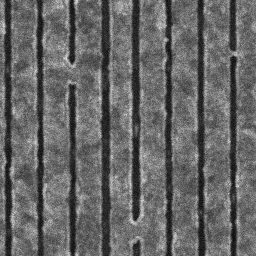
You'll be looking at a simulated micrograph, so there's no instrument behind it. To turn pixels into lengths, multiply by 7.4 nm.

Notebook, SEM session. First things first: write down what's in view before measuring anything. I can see parallel lines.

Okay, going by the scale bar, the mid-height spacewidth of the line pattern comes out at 52.7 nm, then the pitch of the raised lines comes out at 32.1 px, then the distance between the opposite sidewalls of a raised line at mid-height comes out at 0.182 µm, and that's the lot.